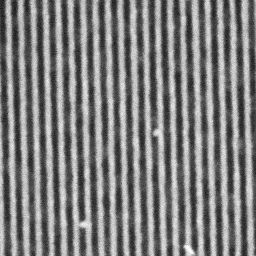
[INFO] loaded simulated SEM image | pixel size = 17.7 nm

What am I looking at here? parallel lines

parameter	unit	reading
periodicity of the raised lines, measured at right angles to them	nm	220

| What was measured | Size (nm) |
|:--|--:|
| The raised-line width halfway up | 72.9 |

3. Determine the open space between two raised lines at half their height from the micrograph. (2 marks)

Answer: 146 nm